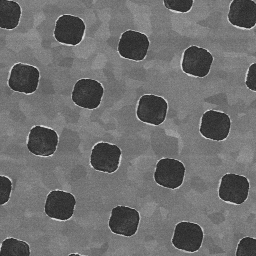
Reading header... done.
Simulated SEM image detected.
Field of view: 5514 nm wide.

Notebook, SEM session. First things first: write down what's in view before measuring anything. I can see a regular array of holes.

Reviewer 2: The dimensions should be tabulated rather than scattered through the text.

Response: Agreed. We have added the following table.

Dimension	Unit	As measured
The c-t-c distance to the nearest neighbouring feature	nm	1410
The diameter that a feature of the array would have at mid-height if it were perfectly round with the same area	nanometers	670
